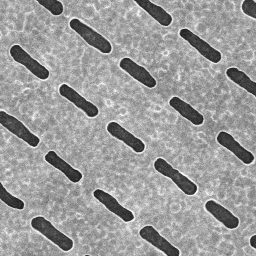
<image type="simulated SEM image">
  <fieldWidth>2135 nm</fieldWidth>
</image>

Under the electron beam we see a regular array of holes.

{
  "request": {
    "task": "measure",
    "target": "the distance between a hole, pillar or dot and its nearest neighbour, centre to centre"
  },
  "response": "60.6 pixels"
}